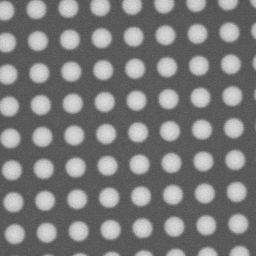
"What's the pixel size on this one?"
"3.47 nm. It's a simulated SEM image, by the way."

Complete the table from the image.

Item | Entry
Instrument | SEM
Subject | an array of small figures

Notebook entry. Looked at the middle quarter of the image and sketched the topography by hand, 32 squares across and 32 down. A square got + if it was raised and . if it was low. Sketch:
++++....++++....++++...+++++...+
++++...+++++...+++++...+++++....
++++....++++....++++....+++.....
++++....+++.....................
................................
................................
.........................++.....
.........++.....++++....++++....
++++....++++....++++....++++....
++++....++++....++++....++++....
++++....++++....++++....++++....
++++.....+++....................
................................
................................
..........................+.....
.........+++.....+++....+++++...
.++++...+++++...+++++...+++++...
+++++...+++++...+++++...+++++...
+++++...+++++....+++.....+++....
.+++.....+++....................
................................
................................
..........................++....
.........+++.....++++....++++...
.++++....++++....++++....++++...
.++++....++++....++++....++++...
.++++....++++....++++....+++....
.++++.....++....................
................................
................................
..........................++....
..........+++....++++....++++...